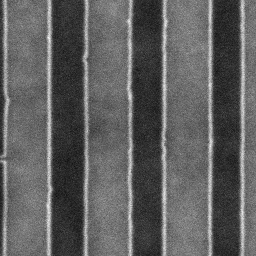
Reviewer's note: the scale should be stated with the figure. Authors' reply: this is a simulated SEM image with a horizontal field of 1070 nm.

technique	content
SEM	one or a few lines or trenches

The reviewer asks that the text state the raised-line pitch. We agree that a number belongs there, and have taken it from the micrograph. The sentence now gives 331 nanometers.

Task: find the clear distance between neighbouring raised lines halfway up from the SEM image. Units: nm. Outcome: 177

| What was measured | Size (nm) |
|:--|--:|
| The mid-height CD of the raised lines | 149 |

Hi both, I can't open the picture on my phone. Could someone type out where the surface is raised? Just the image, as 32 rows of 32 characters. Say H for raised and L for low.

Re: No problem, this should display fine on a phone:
HLLLLLHHHHHLLLLLHHHHHLLLLLHHHHLL
HLLLLLHHHHHLLLLLHHHHHLLLLLHHHHLL
HLLLLLHHHHHLLLLLHHHHHLLLLLHHHHLL
HLLLLLHHHHHLLLLLHHHHHLLLLLHHHHLL
HLLLLLHHHHHLLLLLHHHHHLLLLLHHHHLL
HLLLLLHHHHHLLLLLHHHHHLLLLLHHHHLL
HLLLLLHHHHHLLLLLHHHHHLLLLLHHHHLL
HLLLLLHHHHHLLLLLHHHHHLLLLLHHHHLL
HLLLLLHHHHHLLLLLHHHHHLLLLLHHHHLL
HLLLLLHHHHHLLLLLHHHHHLLLLLHHHHLL
HLLLLLHHHHHLLLLLHHHHHLLLLLHHHHLL
HLLLLLHHHHHLLLLLHHHHHLLLLLHHHHLL
HLLLLLHHHHHLLLLLHHHHHLLLLLHHHHLL
HLLLLLHHHHHLLLLLHHHHHLLLLLHHHHLL
HLLLLLHHHHHLLLLLHHHHHLLLLLHHHHLL
HLLLLLHHHHHLLLLLHHHHHLLLLLHHHHLL
HLLLLLHHHHHLLLLLHHHHHLLLLLHHHHLL
HLLLLLHHHHHLLLLLHHHHHLLLLLHHHHLL
HLLLLLHHHHHLLLLLHHHHHLLLLLHHHHLL
LLLLLLHHHHHLLLLLHHHHHLLLLLHHHHLL
HLLLLLHHHHHLLLLLHHHHHLLLLLHHHHLL
HLLLLLHHHHHLLLLLHHHHHLLLLLHHHHLL
HLLLLLHHHHHLLLLLHHHHHLLLLLHHHHLL
HLLLLLHHHHHLLLLLHHHHHLLLLLHHHHLL
HLLLLLHHHHHLLLLLHHHHHLLLLLHHHHLL
HLLLLLHHHHHLLLLLHHHHHLLLLLHHHHLL
HLLLLLHHHHHLLLLLHHHHHLLLLLHHHHLL
HLLLLLHHHHHLLLLLHHHHHLLLLLHHHHLL
HLLLLLHHHHHLLLLLHHHHHLLLLLHHHHLL
HLLLLLHHHHHLLLLLHHHHHLLLLLHHHHLL
HLLLLLHHHHHLLLLLHHHHHLLLLLHHHHLL
HLLLLLHHHHHLLLLLHHHHHLLLLLHHHHLL